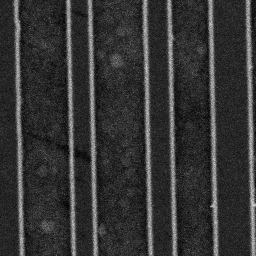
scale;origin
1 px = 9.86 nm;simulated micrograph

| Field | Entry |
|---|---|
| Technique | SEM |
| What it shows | one or a few lines or trenches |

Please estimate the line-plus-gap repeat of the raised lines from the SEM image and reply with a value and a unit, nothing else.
0.739 micrometres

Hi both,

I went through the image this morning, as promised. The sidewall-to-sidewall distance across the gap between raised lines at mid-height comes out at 507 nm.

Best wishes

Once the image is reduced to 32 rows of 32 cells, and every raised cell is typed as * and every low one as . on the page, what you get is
**.......**.......***.....*****.
**.......**.......***.....*****.
**.......**.......***.....*****.
**.......**.......***.....*****.
**.......**.......***.....*****.
**.......**.......***.....*****.
**.......**.......***......****.
**.......**.......***......****.
**.......**.......***......****.
**.......**.......***......****.
**.......**.......***......****.
**.......**.......***......****.
**.......***......***......****.
**.......***......***......****.
**.......***......***......****.
**.......***......***......****.
**.......***......***......****.
**.......***......***......****.
**.......***.......***.....****.
**.......***.......***.....****.
**.......***.......***.....****.
**.......***.......***.....****.
**.......***.......***.....****.
***......***.......***.....*****
***......***.......***.....*****
***......***.......***.....*****
***......***.......***.....*****
***......***.......***.....*****
***......***.......***.....*****
***......***.......***.....*****
***......***.......***.....*****
***......***.......***.....*****